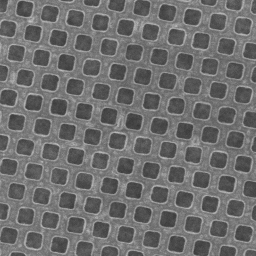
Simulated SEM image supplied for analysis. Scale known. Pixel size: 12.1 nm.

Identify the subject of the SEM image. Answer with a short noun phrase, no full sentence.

a regular array of holes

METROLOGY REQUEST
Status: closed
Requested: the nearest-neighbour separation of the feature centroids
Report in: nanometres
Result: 308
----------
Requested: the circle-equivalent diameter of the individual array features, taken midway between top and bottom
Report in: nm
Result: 214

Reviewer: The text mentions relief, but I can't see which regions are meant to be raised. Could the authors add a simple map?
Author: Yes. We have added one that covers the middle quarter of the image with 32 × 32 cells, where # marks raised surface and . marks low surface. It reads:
...##....###...#############....
..###....###....##...###########
#####....##.....##....##...#####
############...##.....##....###.
#....#############....##....##..
#....###...#############....##..
.....##.....##...#############..
#...###....##.....##...#########
########...##....###....###..###
.############....###....##....##
.##....#############....##....##
.##....###...#########.###....##
###....##....###..#########..###
###....##....###....###.########
#########....##.....##....######
...############....###....##....
...###...#########.###....##....
...##....###...########..###....
..###....##.....##...########...
#####....##....###....###.######
###########....###....##....####
#....############.....##....##..
#....###...########..###....##..
#....##....###..##########..##..
#....##....###....#############.
#######....##....###....########
.############....###....##....##
.###...########..###....##....##
.##....###..#########..###....##
.##....##.....#############...##
###....##.....##....############
#########....##.....##....######